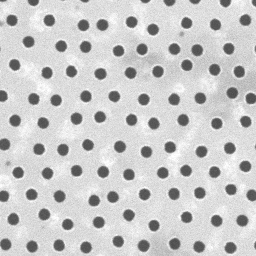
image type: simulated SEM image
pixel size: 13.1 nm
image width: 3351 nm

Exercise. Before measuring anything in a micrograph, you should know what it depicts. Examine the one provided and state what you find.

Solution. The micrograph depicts a regular array of holes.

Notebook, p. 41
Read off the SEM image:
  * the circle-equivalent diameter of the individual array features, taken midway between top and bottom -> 12.1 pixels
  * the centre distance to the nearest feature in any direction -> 315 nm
